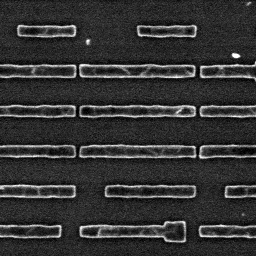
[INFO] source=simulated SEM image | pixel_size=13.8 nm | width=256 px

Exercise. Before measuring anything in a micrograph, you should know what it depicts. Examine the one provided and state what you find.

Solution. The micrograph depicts wiring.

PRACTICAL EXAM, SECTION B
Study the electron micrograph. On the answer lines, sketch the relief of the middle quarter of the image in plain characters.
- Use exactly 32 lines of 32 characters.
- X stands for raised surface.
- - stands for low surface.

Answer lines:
XXX-XXXXXXXXXXXXXXXXXXXX-XXXXXXX
XXX-XXXXXXXXXXXXXXXXXXXXXXXXXXXX
XXX-XXXXXXXXXXXXXXXXXXXXXXXXXXXX
--------------------------------
--------------------------------
--------------------------------
--------------------------------
--------------------------------
--------------------------------
--------------------------------
XX--XXX----X----XXXX--XX-----XXX
XXX-XXXXXXXXXXXXXXXXXXXXXXXXXXXX
XXX-XXXXXXXXXXXXXXXXXXXXXXXXXXXX
--------------------------------
--------------------------------
--------------------------------
--------------------------------
--------------------------------
--------------------------------
--------------------------------
-------------XX-----------------
XXX-XXXXXXXXXXXXXXXXXXXXXXXXXXXX
XXX-XXXXXXXXXXXXXXXXXXXXXXXXXXXX
--------------------------------
--------------------------------
--------------------------------
--------------------------------
--------------------------------
--------------------------------
--------------------------------
-------------X------------------
XXX-------XXXXXXXXXXXXXXXXXXXXXX